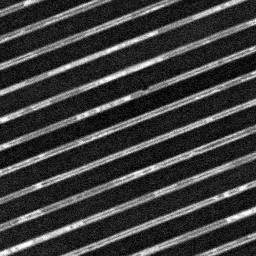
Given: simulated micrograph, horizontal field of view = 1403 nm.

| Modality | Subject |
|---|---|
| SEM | parallel lines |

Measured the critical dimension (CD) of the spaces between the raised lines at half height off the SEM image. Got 0.11 µm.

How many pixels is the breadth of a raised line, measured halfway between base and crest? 5.47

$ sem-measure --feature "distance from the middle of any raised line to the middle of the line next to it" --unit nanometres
137